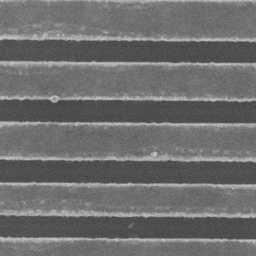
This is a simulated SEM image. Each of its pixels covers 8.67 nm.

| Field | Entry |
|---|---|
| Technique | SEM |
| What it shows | lines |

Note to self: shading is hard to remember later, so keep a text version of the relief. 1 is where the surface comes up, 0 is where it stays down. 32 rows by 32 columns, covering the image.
11111111111111111111111111111111
11111111111111111111111111111111
11111111111111111111111111111111
11111111111111111111111111111111
11111111111111111111111111111111
00000000000000000000000000000000
00000000000000000000000000000000
00000000000000000000000000000000
11111111111111111111111111111111
11111111111111111111111111111111
11111111111111111111111111111111
11111111111111111111111111111111
00000011000000011011111111111111
00000000000000000000000000000000
00000000000000000000000000000000
11111111111111111111111111111111
11111111111111111111111111111111
11111111111111111111111111111111
11111111111111111111111111111111
11111111111111111111111111111111
00000000000000000000000000000000
00000000000000000000000000000000
00000000000000000000000000000000
11111111111111111111111111111111
11111111111111111111111111111111
11111111111111111111111111111111
11111111111111111111111111111111
00000000000000000000000000000000
00000000000000000000000000000000
00000000000000000000000000000000
11111111111111111111111111111111
11111111111111111111111111111111